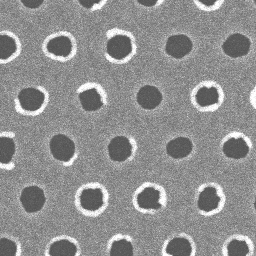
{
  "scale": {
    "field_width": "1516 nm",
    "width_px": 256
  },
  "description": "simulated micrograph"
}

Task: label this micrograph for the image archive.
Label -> a regular array of holes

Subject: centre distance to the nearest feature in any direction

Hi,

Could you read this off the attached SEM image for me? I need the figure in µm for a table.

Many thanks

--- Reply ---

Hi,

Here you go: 0.341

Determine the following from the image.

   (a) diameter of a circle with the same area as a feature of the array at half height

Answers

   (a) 0.143 um